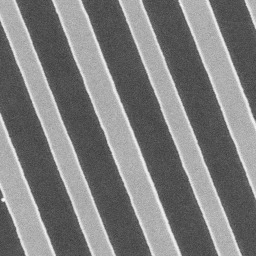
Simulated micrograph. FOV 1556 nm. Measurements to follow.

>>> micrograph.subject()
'lines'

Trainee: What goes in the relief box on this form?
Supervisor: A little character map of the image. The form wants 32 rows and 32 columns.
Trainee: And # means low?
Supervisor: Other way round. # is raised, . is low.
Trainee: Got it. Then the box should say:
##.....###.....###....####.....#
##.....####....###.....####....#
###....####.....###....####.....
###.....###.....###.....###.....
.###....####.....##.....####....
.###.....###.....###....####....
..##.....####....###.....###....
..###....####.....###....####...
..###.....###.....###.....###...
...###....####.....##.....####..
...###.....###.....###....####..
....##.....####....###.....###..
....###....####.....###....####.
....###.....###.....###.....###.
.....##.....####.....##.....####
.....###.....###.....###....####
#.....##.....####....###.....###
#.....###....####.....##.....###
##....###.....###.....###.....##
##.....###....####....###.....##
##.....###.....###.....###....##
###....###.....####....###.....#
###.....###....####.....##.....#
####....###.....###.....###....#
####.....##.....####....###.....
.###.....###.....###.....###....
.####....###.....####....###....
..###.....###....####.....##....
..####....###.....###.....###...
..####.....##.....####....###...
...###.....###.....###.....###..
...####....###.....###.....###..